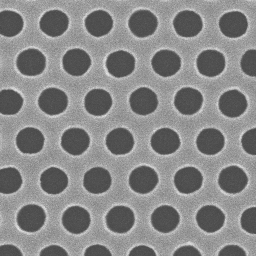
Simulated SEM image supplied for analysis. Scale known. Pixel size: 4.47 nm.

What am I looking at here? a regular array of holes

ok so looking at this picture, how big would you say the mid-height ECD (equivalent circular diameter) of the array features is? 123 nm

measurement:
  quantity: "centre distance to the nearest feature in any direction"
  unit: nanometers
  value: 197